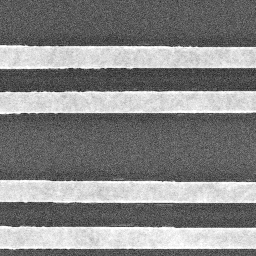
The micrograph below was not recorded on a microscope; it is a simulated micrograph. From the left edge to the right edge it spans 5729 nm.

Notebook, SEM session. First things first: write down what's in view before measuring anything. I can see lines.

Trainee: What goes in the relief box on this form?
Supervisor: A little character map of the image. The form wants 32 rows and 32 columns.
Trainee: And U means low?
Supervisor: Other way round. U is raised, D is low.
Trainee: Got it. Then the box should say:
DDDDDDDDDDDDDDDDDDDDDDDDDDDDDDDD
DDDDDDDDDDDDDDDDDDDDDDDDDDDDDDDD
DDDDDDDDDDDDDDDDDDDDDDDDDDDDDDDD
DDDDDDDDDDDDDDDDDDDDDDDDDDDDDDDD
DDDDDDDDDDDDDDDDDDDDDDDDDDDDDDDD
DDDDDDDDDDDDDDDDDDDDDDDDDDDDDDDD
UUUUUUUUUUUUUUUUUUUUUUUUUUUUUUUU
UUUUUUUUUUUUUUUUUUUUUUUUUUUUUUUU
UUUUUUDUUDUUDDDDDDDDDDDDDDDDDDDD
DDDDDDDDDDDDDDDDDDDDDDDDDDDDDDDD
DDDDDDDDDDDDDDDDDDDDDDDDDDDDDDDD
DDDDDDDDDDDDDDDDDDDDDDDDDDDDDDDD
UUUUUUUUUUUUUUUUUUUUUUUUUUUUUUUU
UUUUUUUUUUUUUUUUUUUUUUUUUUUUUUUU
DDDDDDDDDDDDDDDDDDDDDDDDDDDDDDDD
DDDDDDDDDDDDDDDDDDDDDDDDDDDDDDDD
DDDDDDDDDDDDDDDDDDDDDDDDDDDDDDDD
DDDDDDDDDDDDDDDDDDDDDDDDDDDDDDDD
DDDDDDDDDDDDDDDDDDDDDDDDDDDDDDDD
DDDDDDDDDDDDDDDDDDDDDDDDDDDDDDDD
DDDDDDDDDDDDDDDDDDDDDDDDDDDDDDDD
DDDDDDDDDDDDDDDDDDDDDDDDDDDDDDDD
DDDDDDDDDDDDDDDDDDDDDDDDDDDDDDDD
UUUUUUUUUUUUUUUUUUUUUUUUUUUUUUUU
UUUUUUUUUUUUUUUUUUUUUUUUUUUUUUUU
DDDDDDDDDDDDDDDDDDDDDDDDDDDDDDDD
DDDDDDDDDDDDDDDDDDDDDDDDDDDDDDDD
DDDDDDDDDDDDDDDDDDDDDDDDDDDDDDDD
UUUUUUUUUUUUUUUUUUUUUUDDDDDDDDDD
UUUUUUUUUUUUUUUUUUUUUUUUUUUUUUUU
UUUUUUUUUUUUUUUUUUUUUUUUUUUUUUUU
DDDDDDDDDDDDDDDDDDDDDDDDDDDDDDDD